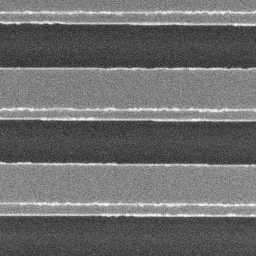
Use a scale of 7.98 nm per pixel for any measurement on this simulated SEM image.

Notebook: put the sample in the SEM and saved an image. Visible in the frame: lines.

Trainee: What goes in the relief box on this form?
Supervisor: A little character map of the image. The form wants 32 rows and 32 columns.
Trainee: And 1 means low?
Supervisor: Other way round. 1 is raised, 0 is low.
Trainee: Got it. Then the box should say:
11111111111111111111111111111111
11111111111111111111111111111111
11111111111111111111111111111111
00000000000000000000000000000000
00000000000000000000000000000000
00000000000000000000000000000000
00000000000000000000000000000000
00000000000000000000000000000000
00000000000000000000000000000000
11111111111111111111111111111111
11111111111111111111111111111111
11111111111111111111111111111111
11111111111111111111111111111111
11111111111111111111111111111111
11111111111111111111111111111111
00000000000000000000000000000000
00000000000000000000000000000000
00000000000000000000000000000000
00000000000000000000000000000000
00000000000000000000000000000000
11111111111111000000000000000000
11111111111111111111111111111111
11111111111111111111111111111111
11111111111111111111111111111111
11111111111111111111111111111111
11111111111111111111111111111111
11111111111111111111111111111111
00000000000000000000000000000000
00000000000000000000000000000000
00000000000000000000000000000000
00000000000000000000000000000000
00000000000000000000000000000000